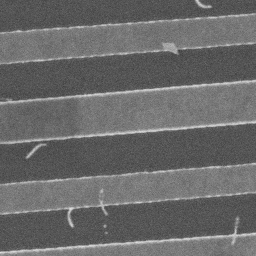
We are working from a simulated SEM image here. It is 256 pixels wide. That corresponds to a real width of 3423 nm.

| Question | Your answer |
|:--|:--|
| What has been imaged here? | lines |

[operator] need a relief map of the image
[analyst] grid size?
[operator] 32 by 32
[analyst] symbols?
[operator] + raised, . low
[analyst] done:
................................
................................
.....................+++++++++++
........++++++++++++++++++++++++
++++++++++++++++++++++++++++++++
++++++++++++++++++++++++++++++..
+++++++++++++++++++..+..........
++++++..........................
................................
................................
..........................++++++
...............+++++++++++++++++
...+++++++++++++++++++++++++++++
++++++++++++++++++++++++++++++++
++++++++++++++++++++++++++++++++
++++++++++++++++++++++++++++++..
+++++++++++++++++++.............
+++++...........................
................................
................................
...............................+
...................+++++++++++++
.......+++++++++++++++++++++++++
++++++++++++++++++++++++++++++++
+++++++++++++++++++++++++++.....
+++++++++++++++.................
++++............................
................................
................................
...........................+++++
.............+++++++++++++++++++
.+++++++++++++++++++++++++++++++